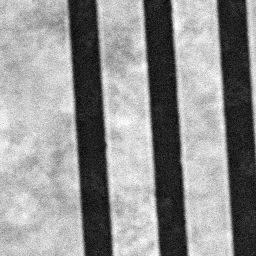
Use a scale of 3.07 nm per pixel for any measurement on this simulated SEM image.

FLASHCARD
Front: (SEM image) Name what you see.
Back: one or a few lines or trenches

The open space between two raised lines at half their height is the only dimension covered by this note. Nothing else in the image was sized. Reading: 98.6 nm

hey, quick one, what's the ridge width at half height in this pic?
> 128 nm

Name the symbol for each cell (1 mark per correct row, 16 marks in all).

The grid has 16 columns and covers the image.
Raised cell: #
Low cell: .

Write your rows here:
####..###..##...
####..###..###..
####..###..###..
####..###..###..
####..###..###..
#####..##..###..
#####..##..###..
#####..##..###..
#####..##..###..
#####..##..###..
#####..###..##..
#####..###..##..
#####..###..##..
#####..###..##..
#####..###..##..
#####..###..##..